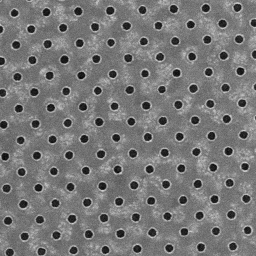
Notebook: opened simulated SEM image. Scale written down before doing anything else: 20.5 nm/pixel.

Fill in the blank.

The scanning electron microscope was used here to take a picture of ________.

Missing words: a regular array of holes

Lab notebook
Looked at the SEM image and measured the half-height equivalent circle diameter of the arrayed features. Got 175 nm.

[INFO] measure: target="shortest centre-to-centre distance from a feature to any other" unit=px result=22.2